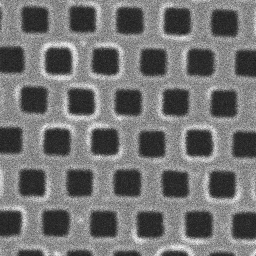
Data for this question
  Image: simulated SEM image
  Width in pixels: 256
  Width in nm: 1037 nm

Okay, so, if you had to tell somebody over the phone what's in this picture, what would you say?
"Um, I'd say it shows a regular array of holes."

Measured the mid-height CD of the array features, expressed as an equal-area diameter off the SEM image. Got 0.124 um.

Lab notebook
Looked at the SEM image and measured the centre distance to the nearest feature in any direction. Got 188 nanometres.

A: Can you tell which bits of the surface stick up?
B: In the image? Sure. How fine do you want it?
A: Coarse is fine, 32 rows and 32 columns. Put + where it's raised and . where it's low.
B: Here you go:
++++++++++++++++++++++++++++++++
+++...+++...++....++....+++..+++
+++...+++...++....++....++....++
+++...+++...++....++....++....++
+++++++++++++++++++++++++++...++
++++++++++++++++++++++++++++++++
...+++...+++...+++...+++...+++..
...+++...++....+++...++....++...
...+++...++....++....++....++...
++++++++++++++++++..+++++.++++..
++++++++++++++++++++++++++++++++
+++...++....++....++....+++...++
+++...++....++....++....++....++
+++...++....++....++....++....++
+++++++++++++++..++++..++++..+++
++++++++++++++++++++++++++++++++
...+++...++....+++..+++...+++...
...++....++....++....++....++...
...++....++....++....++....++...
+++++++.++++++++++..++++..+++...
++++++++++++++++++++++++++++++++
++...+++....++...+++...++++..+++
++....++....++....++....++....++
++....++....++....++....++....++
+++..++++..++++..++++..+++...+++
++++++++++++++++++++++++++++++++
...++....+++..+++...+++...+++++.
...++....++....++...+++....++...
...++....++....++....++....++...
..++++..+++...+++...+++...+++...
++++++++++++++++++++++++++++++++
++...++++..+++...+++...++++..+++